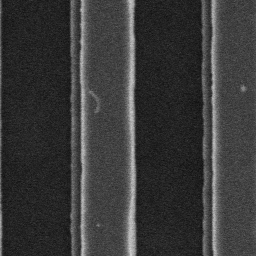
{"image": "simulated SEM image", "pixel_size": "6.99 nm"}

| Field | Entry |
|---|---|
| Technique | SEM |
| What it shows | lines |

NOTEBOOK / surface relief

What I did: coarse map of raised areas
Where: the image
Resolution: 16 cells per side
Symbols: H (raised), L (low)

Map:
LLLLLHHHLLLLLHHH
LLLLLHHHLLLLLHHH
LLLLLHHHLLLLLHHH
LLLLLHHHLLLLLHHH
LLLLLHHHLLLLLHHH
LLLLLHHHLLLLLHHH
LLLLLHHHLLLLLHHH
LLLLLHHHLLLLLHHH
LLLLLHHHLLLLLHHH
LLLLLHHHLLLLLHHH
LLLLLHHHLLLLLHHH
LLLLLHHHLLLLLHHH
LLLLLHHHLLLLLHHH
LLLLLHHHLLLLLHHH
LLLLLHHHLLLLLHHH
LLLLLHHHLLLLLHHH